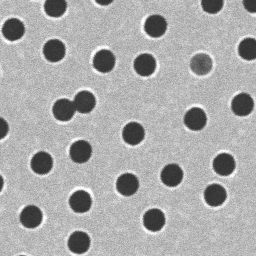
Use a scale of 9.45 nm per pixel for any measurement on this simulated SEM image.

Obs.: a regular array of holes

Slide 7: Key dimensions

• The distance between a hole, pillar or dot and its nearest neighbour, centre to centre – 404 nm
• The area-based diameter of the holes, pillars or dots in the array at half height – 228 nanometres